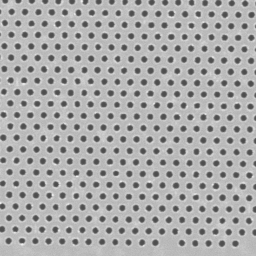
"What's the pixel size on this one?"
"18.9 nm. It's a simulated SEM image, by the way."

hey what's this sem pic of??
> a regular array of holes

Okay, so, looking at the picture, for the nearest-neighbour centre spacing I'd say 242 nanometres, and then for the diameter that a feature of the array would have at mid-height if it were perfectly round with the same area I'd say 124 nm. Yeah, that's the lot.